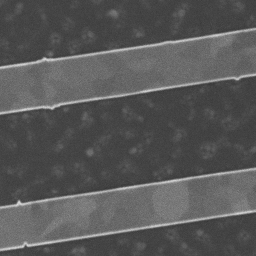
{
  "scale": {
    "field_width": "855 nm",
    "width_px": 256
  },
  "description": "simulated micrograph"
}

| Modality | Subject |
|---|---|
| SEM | one or a few lines or trenches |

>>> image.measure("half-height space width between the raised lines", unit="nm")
309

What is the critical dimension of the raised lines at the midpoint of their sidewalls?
148 nanometers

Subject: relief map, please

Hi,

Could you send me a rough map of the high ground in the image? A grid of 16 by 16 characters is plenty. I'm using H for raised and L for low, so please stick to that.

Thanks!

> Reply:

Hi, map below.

LLLLLLLLLLLLLLLL
LLLLLLLLLLLLLLLL
LLLLLLLLLLLLHHHH
LLLLLHHHHHHHHHHH
HHHHHHHHHHHHHHHH
HHHHHHHHHHLLLLLL
HHHHLLLLLLLLLLLL
LLLLLLLLLLLLLLLL
LLLLLLLLLLLLLLLL
LLLLLLLLLLLLLLLL
LLLLLLLLLLLLLLLL
LLLLLLLLLHHHHHHH
LLLHHHHHHHHHHHHH
HHHHHHHHHHHHHHLL
HHHHHHHLLLLLLLLL
HLLLLLLLLLLLLLLL